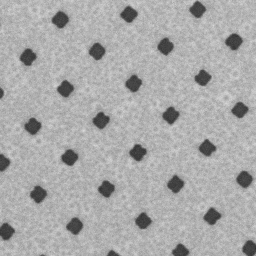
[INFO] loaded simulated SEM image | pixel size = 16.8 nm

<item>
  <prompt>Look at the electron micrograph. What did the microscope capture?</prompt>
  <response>a regular array of holes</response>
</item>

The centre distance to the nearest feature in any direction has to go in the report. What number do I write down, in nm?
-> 816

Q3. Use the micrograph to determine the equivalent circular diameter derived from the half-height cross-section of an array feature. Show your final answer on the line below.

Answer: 278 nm